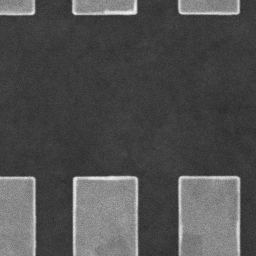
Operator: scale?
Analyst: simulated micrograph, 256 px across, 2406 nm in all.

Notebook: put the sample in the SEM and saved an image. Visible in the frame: wiring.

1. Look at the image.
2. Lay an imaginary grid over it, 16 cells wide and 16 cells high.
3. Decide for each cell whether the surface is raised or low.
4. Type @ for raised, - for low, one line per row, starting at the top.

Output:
@@---@@@---@@@@-
----------------
----------------
----------------
----------------
----------------
----------------
----------------
----------------
----------------
----------------
@@---@@@@--@@@@-
@@---@@@@--@@@@-
@@---@@@@--@@@@-
@@---@@@@--@@@@-
@@---@@@@--@@@@-